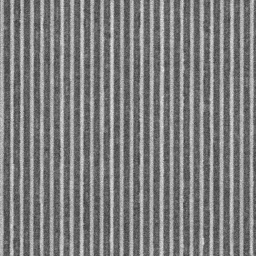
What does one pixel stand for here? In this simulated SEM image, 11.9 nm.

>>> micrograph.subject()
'parallel lines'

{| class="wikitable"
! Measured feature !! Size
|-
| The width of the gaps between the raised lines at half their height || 80.7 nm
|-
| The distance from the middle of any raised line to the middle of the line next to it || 119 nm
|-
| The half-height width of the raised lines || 0.0344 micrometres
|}